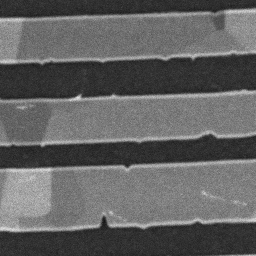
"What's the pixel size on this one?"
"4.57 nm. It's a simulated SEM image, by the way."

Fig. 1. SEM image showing one or a few lines or trenches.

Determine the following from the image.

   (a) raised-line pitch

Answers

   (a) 363 nm